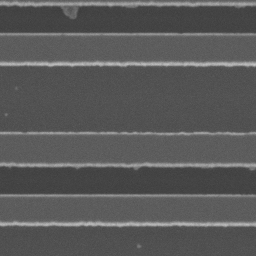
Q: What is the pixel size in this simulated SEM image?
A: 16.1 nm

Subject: lines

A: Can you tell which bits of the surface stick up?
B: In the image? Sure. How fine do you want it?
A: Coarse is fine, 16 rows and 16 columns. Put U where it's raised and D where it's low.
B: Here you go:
DDDDDDDDDDDDDDDD
DDDDDDDDDDDDDDDD
UUUUUUUUUUUUUUUU
UUUUUUUUUUUUUUUU
DDDDDDDDDDDDDDDD
DDDDDDDDDDDDDDDD
DDDDDDDDDDDDDDDD
DDDDDDDDDDDDDDDD
UUUUUUUUUUUUUUUU
UUUUUUUUUUUUUUUU
DDDDDDDDDDDDDDDD
DDDDDDDDDDDDDDDD
UUUUUUUUUUUUUUUU
UUUUUUUUUUUUUUUU
DDDDDDDDDDDDDDDD
DDDDDDDDDDDDDDDD